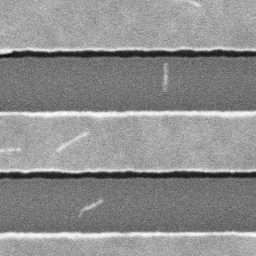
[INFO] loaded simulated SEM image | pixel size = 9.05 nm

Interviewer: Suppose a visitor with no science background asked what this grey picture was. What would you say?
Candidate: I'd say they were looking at lines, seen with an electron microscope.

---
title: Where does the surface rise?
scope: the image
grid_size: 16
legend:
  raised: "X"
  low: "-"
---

XXXXXXXXXXXXXXXX
XXXXXXXXXXXXXXXX
XXXXXXXXXXXXXXXX
----------------
----------------
----------------
----------------
XXXXXXXXXXXXXXXX
XXXXXXXXXXXXXXXX
XXXXXXXXXXXXXXXX
XXXXXXXXXXXXXXXX
----------------
----------------
----------------
----------------
XXXXXXXXXXXXXXXX